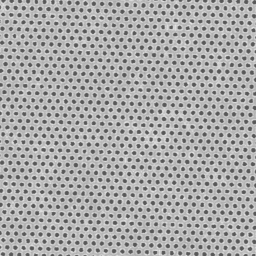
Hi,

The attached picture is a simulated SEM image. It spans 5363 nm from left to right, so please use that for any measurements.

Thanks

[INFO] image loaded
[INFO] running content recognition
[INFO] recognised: a regular array of holes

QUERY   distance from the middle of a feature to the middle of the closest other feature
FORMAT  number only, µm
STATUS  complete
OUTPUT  0.166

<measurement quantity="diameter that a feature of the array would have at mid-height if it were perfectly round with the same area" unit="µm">0.0946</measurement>